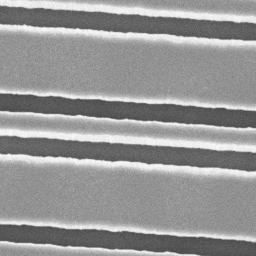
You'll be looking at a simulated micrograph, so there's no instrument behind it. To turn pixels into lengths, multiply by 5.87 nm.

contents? lines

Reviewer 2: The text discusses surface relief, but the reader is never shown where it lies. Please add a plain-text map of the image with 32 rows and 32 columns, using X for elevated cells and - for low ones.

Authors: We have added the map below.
--XXXXXXXXXXXXXXXXXXXXXXXXXXXXXX
-----------------XXXXXXXXXXXXXXX
-------------------------------X
XXXX----------------------------
XXXXXXXXXXXXXXXXXXXXX-----------
XXXXXXXXXXXXXXXXXXXXXXXXXXXXXXXX
XXXXXXXXXXXXXXXXXXXXXXXXXXXXXXXX
XXXXXXXXXXXXXXXXXXXXXXXXXXXXXXXX
XXXXXXXXXXXXXXXXXXXXXXXXXXXXXXXX
XXXXXXXXXXXXXXXXXXXXXXXXXXXXXXXX
XXXXXXXXXXXXXXXXXXXXXXXXXXXXXXXX
XXXXXXXXXXXXXXXXXXXXXXXXXXXXXXXX
-------------XXXXXXXXXXXXXXXXXXX
----------------------------XXXX
XXXXXXXXXX----------------------
XXXXXXXXXXXXXXXXXXXXXXX---------
XXXXXXXXXXXXXXXXXXXXXXXXXXXXXXXX
-------------XXXXXXXXXXXXXXXXXXX
-----------------------------XXX
X-------------------------------
XXXXXXXXXXXXXXXXXX--------------
XXXXXXXXXXXXXXXXXXXXXXXXXXXXXX--
XXXXXXXXXXXXXXXXXXXXXXXXXXXXXXXX
XXXXXXXXXXXXXXXXXXXXXXXXXXXXXXXX
XXXXXXXXXXXXXXXXXXXXXXXXXXXXXXXX
XXXXXXXXXXXXXXXXXXXXXXXXXXXXXXXX
XXXXXXXXXXXXXXXXXXXXXXXXXXXXXXXX
XXXXXXXXXXXXXXXXXXXXXXXXXXXXXXXX
--------XXXXXXXXXXXXXXXXXXXXXXXX
----------------------XXXXXXXXXX
XXXXX---------------------------
XXXXXXXXXXXXXXXXXXX-------------